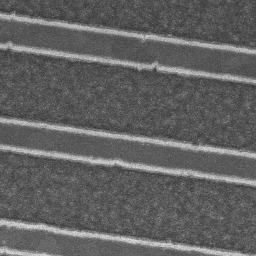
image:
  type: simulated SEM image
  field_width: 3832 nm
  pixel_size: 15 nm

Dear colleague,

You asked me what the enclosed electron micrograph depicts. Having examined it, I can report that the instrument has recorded one or a few lines or trenches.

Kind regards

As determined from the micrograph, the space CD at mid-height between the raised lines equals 1100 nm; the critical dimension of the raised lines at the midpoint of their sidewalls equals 428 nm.